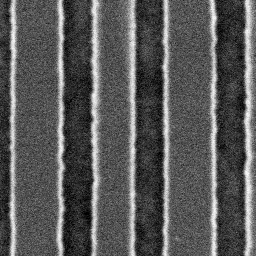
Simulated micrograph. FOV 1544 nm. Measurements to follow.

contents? lines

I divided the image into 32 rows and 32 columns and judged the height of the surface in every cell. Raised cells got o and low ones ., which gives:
..oooooo....ooooo....oooooo....o
.ooooooo....ooooo....oooooo....o
..oooooo....ooooo....oooooo....o
..oooooo....ooooo....oooooo....o
.ooooooo....ooooo....oooooo....o
.ooooooo....ooooo....oooooo....o
..oooooo....ooooo....oooooo....o
..oooooo....ooooo....oooooo....o
..oooooo....ooooo....oooooo....o
.ooooooo....ooooo....oooooo....o
.ooooooo....ooooo....oooooo....o
.ooooooo....ooooo....oooooo....o
..oooooo....ooooo....oooooo....o
.ooooooo....ooooo....oooooo....o
.ooooooo....ooooo....oooooo....o
.ooooooo....ooooo....oooooo....o
.ooooooo....ooooo....oooooo....o
.ooooooo....ooooo....oooooo....o
.ooooooo....ooooo....oooooo....o
..oooooo....ooooo....oooooo....o
.ooooooo....ooooo....oooooo....o
.ooooooo....ooooo....oooooo....o
.ooooooo....ooooo....oooooo....o
.ooooooo....ooooo....oooooo....o
.ooooooo....ooooo....oooooo....o
.ooooooo....ooooo....oooooo....o
.ooooooo....ooooo....oooooo....o
.ooooooo....ooooo....oooooo....o
..oooooo....ooooo....oooooo....o
..ooooo.....ooooo....oooooo....o
.ooooooo....ooooo....oooooo....o
.ooooooo....ooooo...ooooooo....o